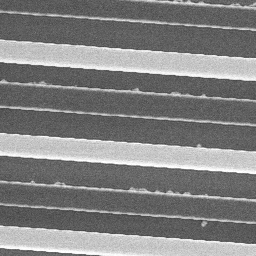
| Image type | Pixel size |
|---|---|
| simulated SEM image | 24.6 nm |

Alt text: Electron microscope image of lines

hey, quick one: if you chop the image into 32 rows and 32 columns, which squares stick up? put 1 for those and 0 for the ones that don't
11111111111111111111111100000000
01111111111111111111111111111111
00000000000000011111111111111111
00000000000000000000000000001111
00000000000000000000000000000000
11111100000000000000000000000000
11111111111111111111100000000000
11111111111111111111111111111111
00000000000111111111111111111111
00000000000000000000000011111111
11110000000000000000000000000000
11111111111111111100000000000000
11111111111111111111111111111110
01111111111111111111111111111111
00000000000000011111111111111111
00000000000000000000000000000011
00000000000000000000000000000000
11111111111000000000000000000000
11111111111111111111111100000000
00011111111111111111111111111111
00000000000000000111111111111111
00000000000000000000000000000011
00000000000000000000000000000000
11111111111000000000000000000000
11111111111111111111111110000000
11111111111111111111111111111111
00000000000011111111111111111111
00000000000000000000000000111111
11100000000000000000000000000000
11111111111111111100000000000000
11111111111111111111111111111110
00000000111111111111111111111111